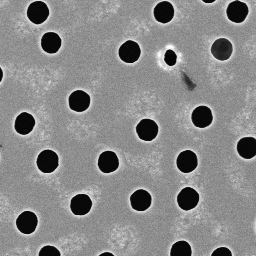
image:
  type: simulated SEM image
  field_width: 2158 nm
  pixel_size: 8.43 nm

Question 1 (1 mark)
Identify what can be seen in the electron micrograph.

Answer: a regular array of holes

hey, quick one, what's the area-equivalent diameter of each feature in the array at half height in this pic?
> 0.183 um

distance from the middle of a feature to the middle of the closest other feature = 398 nm